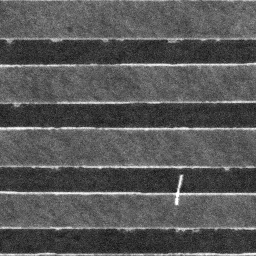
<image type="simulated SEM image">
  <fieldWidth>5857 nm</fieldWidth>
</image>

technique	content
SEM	lines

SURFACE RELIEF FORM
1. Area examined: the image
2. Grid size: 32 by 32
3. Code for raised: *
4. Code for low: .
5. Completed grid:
********************************
********************************
********************************
********************************
********************************
................................
................................
................................
********************************
********************************
********************************
********************************
********************************
................................
................................
................................
********************************
********************************
********************************
********************************
********************************
................................
................................
................................
********************************
********************************
********************************
********************************
......................**.......*
................................
................................
................................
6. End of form